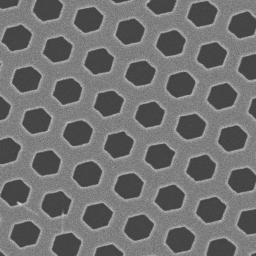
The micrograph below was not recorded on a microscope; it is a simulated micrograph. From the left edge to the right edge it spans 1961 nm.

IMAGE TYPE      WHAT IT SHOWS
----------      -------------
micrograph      a regular array of holes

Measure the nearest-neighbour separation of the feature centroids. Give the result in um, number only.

0.326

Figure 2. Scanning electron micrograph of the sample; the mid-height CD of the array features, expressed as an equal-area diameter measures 205 nm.